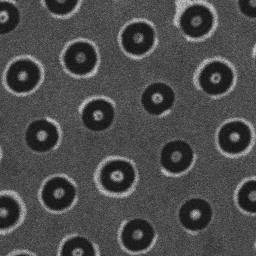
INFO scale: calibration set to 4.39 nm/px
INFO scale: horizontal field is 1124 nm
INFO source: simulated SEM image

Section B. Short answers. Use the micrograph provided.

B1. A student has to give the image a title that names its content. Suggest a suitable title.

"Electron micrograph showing a regular array of ring-shaped grooves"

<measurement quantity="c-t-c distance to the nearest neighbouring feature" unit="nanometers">266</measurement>